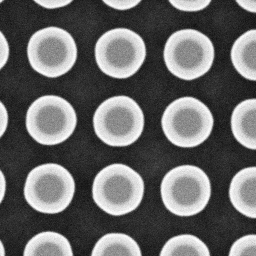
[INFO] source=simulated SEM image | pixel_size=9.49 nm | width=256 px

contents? an array of small figures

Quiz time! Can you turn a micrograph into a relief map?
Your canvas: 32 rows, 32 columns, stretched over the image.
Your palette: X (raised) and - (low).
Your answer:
-----XXX-----XXXX-----XXXX----XX
--------------------------------
--------------------------------
------X-------------------------
----XXXXX----XXXX----XXXXX----XX
X---XXXXX---XXXXXX---XXXXX---XXX
X--XXXXXXX--XXXXXX---XXXXXX--XXX
X---XXXXX---XXXXXX---XXXXXX--XXX
----XXXXX----XXXX----XXXXX---XXX
------X-------XX------XXX-----XX
--------------------------------
--------------------------------
-----XXX-----XXXX-----XXX------X
X---XXXXX---XXXXX----XXXXX---XXX
X--XXXXXX---XXXXXX--XXXXXX---XXX
X--XXXXXX---XXXXXX--XXXXXXX--XXX
X---XXXXX---XXXXXX---XXXXX---XXX
----XXXX-----XXXX----XXXXX----XX
-------------------------------X
--------------------------------
------X-------------------------
----XXXX-----XXXX----XXXX-----XX
X--XXXXXX---XXXXXX--XXXXXX---XXX
X--XXXXXX---XXXXXX--XXXXXX---XXX
---XXXXXX---XXXXXX--XXXXXX---XXX
----XXXXX---XXXXX----XXXXX---XXX
-----XX------XXX------XXX-----XX
--------------------------------
--------------------------------
----XXXX-----XXX------XX-------X
---XXXXXX---XXXXX----XXXXX---XXX
---XXXXXX---XXXXX---XXXXXX---XXX